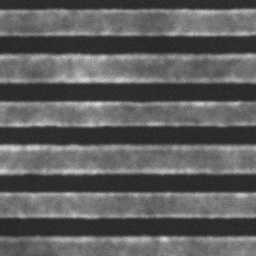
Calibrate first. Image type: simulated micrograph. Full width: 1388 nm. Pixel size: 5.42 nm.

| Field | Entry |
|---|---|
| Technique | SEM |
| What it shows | lines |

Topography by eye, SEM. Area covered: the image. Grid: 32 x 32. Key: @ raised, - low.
--------------------------------
@@@@@@@@@@@@@@@@@@@@@@@@@@@@@@@@
@@@@@@@@@@@@@@@@@@@@@@@@@@@@@@@@
@@@@@@@@@@@@@@@@@@@@@@@@@@@@@@@@
--@@----------------------------
--------------------------------
--------------------------------
@@@@@@@@@@@@@@@@@@@@@@@@@@@@@@@@
@@@@@@@@@@@@@@@@@@@@@@@@@@@@@@@@
@@@@@@@@@@@@@@@@@@@@@@@@@@@@@@@@
--------------------------------
--------------------------------
--------------------------------
@@@@@@@@@@@@@@@@@@@@@@@@@@@@@@@@
@@@@@@@@@@@@@@@@@@@@@@@@@@@@@@@@
@@@@@@@@@@@@@@@@@@@@@@@@@@@@@@@@
--------------------------------
--------------------------------
@@@@@@@@@@@@@@@@@@@@@@@@@@@@@@@@
@@@@@@@@@@@@@@@@@@@@@@@@@@@@@@@@
@@@@@@@@@@@@@@@@@@@@@@@@@@@@@@@@
@@@@@@@@@@@@@@@@@@@@@@@@@@@@@@@@
--------------------------------
--------------------------------
@@@@@@@@@@@@@@@@@@@@@@@@@@@@@@@@
@@@@@@@@@@@@@@@@@@@@@@@@@@@@@@@@
@@@@@@@@@@@@@@@@@@@@@@@@@@@@@@@@
--------------------------------
--------------------------------
--------------------------------
@@@@@@@@@@@@@@@@@@@@@@@@@@@@@@@@
@@@@@@@@@@@@@@@@@@@@@@@@@@@@@@@@